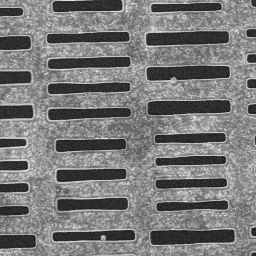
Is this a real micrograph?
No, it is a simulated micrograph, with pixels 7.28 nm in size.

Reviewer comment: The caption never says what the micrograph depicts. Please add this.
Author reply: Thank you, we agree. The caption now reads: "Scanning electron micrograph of groups of lines, slits or small figures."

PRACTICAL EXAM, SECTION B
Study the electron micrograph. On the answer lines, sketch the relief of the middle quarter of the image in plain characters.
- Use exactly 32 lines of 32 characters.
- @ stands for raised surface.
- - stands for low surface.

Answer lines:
-----------------@@-@@@@@@@@@@--
@@@@@@@@@@@@@@@@@@@@------------
@@@@@@@@@@@@@@@@@@@@------------
@@@@@@@@@@@@@@@@@@@@-------@----
-@@@@@@@@@------@@@@@@@@@@@@@@@@
-----------------@@@@@@-@@@@@@@@
-----------------@@@@@@@@@@@@@@@
-@@@@@@@@@@@@@@@@@@@@@@@@@@@@@@@
@@@@@@@@@@@@@@@@@@@@@@@@@@@@@@@@
@@@@@@@@@@@@-@@@@@@@@-----------
@@@@@@@@@@@@@@@@@@@@@-----------
-----------------@@@@-----------
-----------------@@@@-----------
---------------@@@@@@@@@@@@@@@@@
@@@@@@@@@@@@@@@@@@@@@@@@@@@@@@@@
@@@@@@@@@@@@@@@@@@@@@@@@@@@@@@@@
@@@@@@@@@@@@@@@@@@@@@@@@-@@@@@@@
@@@@@@-@@@@@@@@@@@@@@@@@--------
@@@@@@@@@@@@@@@@@@@@@@@---------
----------------@@@@@@@---------
----------------@@@@@@@@@@@@@@@@
---------------@@@@@@@@@@@@@@@@@
@@@@@@@@@@@@@@@@@@@@@@@@@@@@@@@@
@@@@@@@@@@@@@@@@@@@@@@@---------
@@@@@@@@@@@@@@@@@@@@@@@---------
@@@@@@@@@@@@@@@@@@@@@@@---------
----------------@@@@@@@-@@@@@@@@
----------------@@@@@@@@@@@@@@@@
----------------@@@@@@@@@@@@@@@@
-----@@@@@@@@@@@@@@@@@@---------
@@@@@@@@@@@@@@@@@@@@@@@---------
@@@@@--@@@@@@@@@@@@@@@@@@@@@@@@@